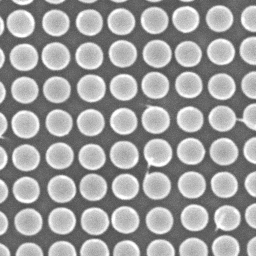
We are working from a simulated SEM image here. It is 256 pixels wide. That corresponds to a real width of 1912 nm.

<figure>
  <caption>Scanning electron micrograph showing a regular array of raised bodies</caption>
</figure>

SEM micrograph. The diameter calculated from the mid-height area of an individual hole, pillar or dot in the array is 194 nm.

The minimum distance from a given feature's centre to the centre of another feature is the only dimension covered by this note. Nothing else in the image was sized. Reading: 238 nanometers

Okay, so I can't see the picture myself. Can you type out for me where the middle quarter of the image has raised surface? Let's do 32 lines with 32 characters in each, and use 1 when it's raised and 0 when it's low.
00001111100000110000001110000011
00000000000000000000000000000000
00000000000000000000011100000011
00000111100001111000111110000111
10001111110011111100111111001111
10001111110011111100111111001111
10001111110011111100111111001111
10001111110011111100111110000111
10000111100001111000000000000000
00000000000000000000000000000000
00000000000000000000000000000000
00000000000000110000011110000111
10001111100011111100111111000111
11001111110011111100111111000111
11001111110011111100111111000111
11001111110011111100111111000111
10001111100001111000011110000011
00000111000000000000000000000000
00000000000000000000000000000000
00000000000000110000011110000011
10000111000011111100111111000111
11001111100011111100111111100111
11001111110011111100111111100111
11001111110011111100111111100111
11001111110011111100011111000011
10000111100001111000000000000000
00000000000000000000000000000000
00000000000000000000001100000011
10000111110001111100111111000111
11001111110011111100111111000111
11101111111011111100111111000111
11101111111011111100111111000111